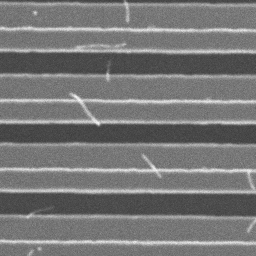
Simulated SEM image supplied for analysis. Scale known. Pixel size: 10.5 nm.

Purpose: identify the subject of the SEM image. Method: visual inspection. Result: lines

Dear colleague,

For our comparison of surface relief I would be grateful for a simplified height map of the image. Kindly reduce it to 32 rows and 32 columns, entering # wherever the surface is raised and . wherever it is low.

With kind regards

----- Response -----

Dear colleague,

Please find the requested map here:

###########....#................
################################
################################
################################
################################
################################
...........#..##################
................................
................................
#############################...
################################
################################
################################
################################
################################
............#...................
................................
................................
################################
################################
################################
################################
################################
################################
................................
................................
................................
################################
################################
################################
################################
################################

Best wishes